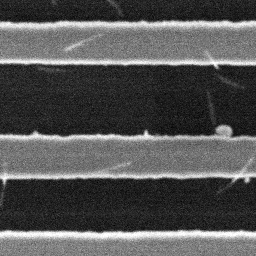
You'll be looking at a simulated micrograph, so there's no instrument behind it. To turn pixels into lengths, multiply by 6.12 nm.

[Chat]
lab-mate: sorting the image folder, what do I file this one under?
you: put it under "lines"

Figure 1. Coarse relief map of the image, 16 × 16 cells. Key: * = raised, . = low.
................
****************
****************
****************
................
................
................
................
***..***........
****************
****************
................
................
................
*****...********
****************